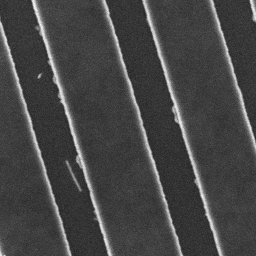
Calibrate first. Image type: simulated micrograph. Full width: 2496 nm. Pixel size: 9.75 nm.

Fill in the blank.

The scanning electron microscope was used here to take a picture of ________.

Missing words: lines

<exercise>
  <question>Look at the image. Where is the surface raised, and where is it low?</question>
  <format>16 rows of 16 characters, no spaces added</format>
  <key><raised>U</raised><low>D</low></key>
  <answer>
DDUUUUUDDUUUUDDD
DDUUUUUDDUUUUUDD
DDDUUUUDDDUUUUDD
UDDUUUUUDDUUUUDD
UDDUUUUUDDUUUUUD
UDDDUUUUDDDUUUUD
UUDDUUUUUDDUUUUD
UUDDUUUUUDDUUUUU
UUDDDUUUUDDUUUUU
UUDDDUUUUDDDUUUU
UUUDDUUUUUDDUUUU
UUUDDUUUUUDDUUUU
UUUDDDUUUUDDDUUU
UUUUDDUUUUUDDUUU
UUUUDDUUUUUDDUUU
UUUUDDDUUUUDDDUU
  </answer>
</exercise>